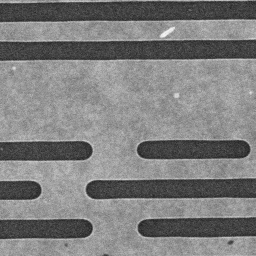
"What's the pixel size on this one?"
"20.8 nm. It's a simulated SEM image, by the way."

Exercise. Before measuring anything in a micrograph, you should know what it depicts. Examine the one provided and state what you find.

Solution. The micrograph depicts groups of lines, slits or small figures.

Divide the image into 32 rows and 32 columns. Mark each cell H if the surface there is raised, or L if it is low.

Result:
LLLLLLLLLLLLLLLLLLLLLLLLLLLLLLLL
LLLLLLLLLLLLLLLLLLLLLLLLLLLLLLLL
LLLLLLLLLLLLLLLLLLLLLLLLLLLLLLLL
HHHHHHHHHHHHHHHHHHHHHHHHHHHHHHHH
HHHHHHHHHHHHHHHHHHHHHHHHHHHHHHHH
LLLLLLLLLLLLLLLLLLLLLLLLLLLLLLLL
LLLLLLLLLLLLLLLLLLLLLLLLLLLLLLLL
LLLLLLLLLLLLLLLLLLLLLLLLLHHHHHHH
HHHHHHHHHHHHHHHHHHHHHHHHHHHHHHHH
HHHHHHHHHHHHHHHHHHHHHHHHHHHHHHHH
HHHHHHHHHHHHHHHHHHHHHHHHHHHHHHHH
HHHHHHHHHHHHHHHHHHHHHHHHHHHHHHHH
HHHHHHHHHHHHHHHHHHHHHHHHHHHHHHHH
HHHHHHHHHHHHHHHHHHHHHHHHHHHHHHHH
HHHHHHHHHHHHHHHHHHHHHHHHHHHHHHHH
HHHHHHHHHHHHHHHHHHHHHHHHHHHHHHHH
HHHHHHHHHHHHHHHHHHHHHHHHHHHHHHHH
HHHHHHHHHHHHHHHHHHHLLLLLLLLLLLHH
LLLLLLLLLLLLHHHHHLLLLLLLLLLLLLLH
LLLLLLLLLLLHHHHHHLLLLLLLLLLLLLLH
HHHHHHHHHHHHHHHHHHHHHHHHHHHHHHHH
HHHHHHHHHHHHHHHHHHHHHHHHHHHHHHHH
HHHHHHHHHHHHLLLLLLLLLLLLLLLLLLLL
LLLLLHHHHHHLLLLLLLLLLLLLLLLLLLLL
LLLLLHHHHHHLLLLLLLLLLLLLLLLLLLLL
HHHHHHHHHHHHHHHHHHHHHHHHHHHHHHHH
HHHHHHHHHHHHHHHHHHHHHHHHHHHHHHHH
LLLLLLLLLLLHHHHHHHLLLLLLLLLLLLLL
LLLLLLLLLLLLHHHHHLLLLLLLLLLLLLLL
LLLLLLLLLLLHHHHHHHLLLLLLLLLLLLLL
HHHHHHHHHHHHHHHHHHHHHHHHHHHHHHHH
HHHHHHHHHHHHHHHHHHHHHHHHHHHHHHHH